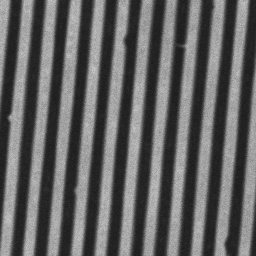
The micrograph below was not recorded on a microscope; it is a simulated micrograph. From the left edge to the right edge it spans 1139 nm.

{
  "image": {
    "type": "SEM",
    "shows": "parallel lines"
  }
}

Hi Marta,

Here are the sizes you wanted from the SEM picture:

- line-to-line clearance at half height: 49.8 nm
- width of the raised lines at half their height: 53.6 nm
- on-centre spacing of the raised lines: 0.106 um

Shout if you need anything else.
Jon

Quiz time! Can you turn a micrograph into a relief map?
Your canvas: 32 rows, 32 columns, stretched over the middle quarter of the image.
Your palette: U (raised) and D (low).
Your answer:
UUUDDDUUUDDDUUUDDDUUUDDDUUUDDDUU
UUUDDDUUUDDDUUUDDDUUUDDDUUUDDDUU
UUUDDDUUUDDDUUUDDDUUUDDDUUUDDDUU
UUUDDDUUUDDDUUUDDDUUDDDUUUUDDDUU
UUUDDDUUDDDUUUUDDDUUDDDUUUUDDUUU
UUUDDDUUDDDUUUDDDUUUDDDUUUUDDUUU
UUDDDUUUDDDUUUDDDUUUDDDUUUDDDUUU
UUDDDUUUDDDUUUDDDUUUDDDUUUDDDUUU
UUDDDUUUDDDUUUDDDUUUDDDUUUDDDUUU
UUDDDUUUDDDUUUDDDUUUDDDUUUDDDUUU
UUDDDUUUDDDUUUDDDUUUDDDUUUDDDUUU
UUDDDUUUDDDUUUDDDUUUDDDUUUDDDUUU
UUDDDUUUDDDUUUDDDUUUDDDUUUDDDUUU
UUDDDUUUDDDUUUDDDUUUDDDUUUDDDUUD
UUDDDUUUDDDUUUDDDUUUDDDUUUDDDUUD
UUDDDUUUDDUUUUDDDUUUDDDUUDDDUUUD
UUDDDUUUDDUUUDDDUUUUDDDUUDDDUUUD
UDDDUUUUDDUUUDDDUUUDDDUUUDDDUUUD
UDDDUUUDDDUUUDDDUUUDDDUUUDDDUUUD
UDDDUUUDDDUUUDDDUUUDDDUUUDDDUUUD
UDDDUUUDDDUUUDDDUUUDDDUUUDDDUUUD
UDDDUUUDDDUUUDDDUUUDDDUUUDDDUUUD
UDDDUUUDDDUUUDDDUUUDDDUUUDDDUUUD
UDDDUUUDDDUUUDDDUUUDDDUUDDDDUUUD
UDDDUUUDDDUUDDDDUUUDDDUUDDDDUUDD
DDDDUUUDDDUUDDDDUUDDDDUUDDDDUUDD
DDDDUUDDDDUUDDDDUUDDDDUUDDDUUUDD
DDDDUUDDDDUUDDDUUUDDDDUUDDDUUUDD
DDDUUUDDDUUUDDDUUUDDDUUUDDDUUUDD
DDDUUUDDDUUUDDDUUUDDDDUUDDDUUUDD
DDDUUUDDDUUUDDDUUUDDDUUUDDDUUUDD
DDDUUUDDDUUUDDDUUUDDDUUUDDDUUUDD